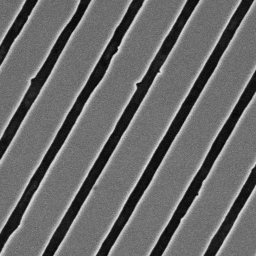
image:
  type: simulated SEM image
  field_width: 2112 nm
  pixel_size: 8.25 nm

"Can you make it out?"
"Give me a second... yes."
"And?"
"parallel lines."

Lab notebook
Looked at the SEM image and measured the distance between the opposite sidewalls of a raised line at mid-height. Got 0.298 microns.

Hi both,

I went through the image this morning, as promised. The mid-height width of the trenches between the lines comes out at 86.1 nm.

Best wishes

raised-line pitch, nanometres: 387